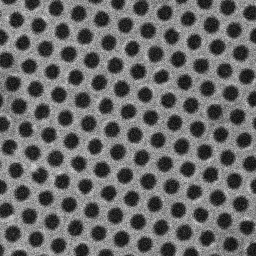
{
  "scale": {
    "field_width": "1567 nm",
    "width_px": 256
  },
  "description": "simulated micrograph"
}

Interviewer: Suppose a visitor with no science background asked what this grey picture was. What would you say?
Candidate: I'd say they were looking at a regular array of holes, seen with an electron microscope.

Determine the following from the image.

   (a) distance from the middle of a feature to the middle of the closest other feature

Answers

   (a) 144 nanometres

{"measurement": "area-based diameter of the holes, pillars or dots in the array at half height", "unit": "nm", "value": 103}